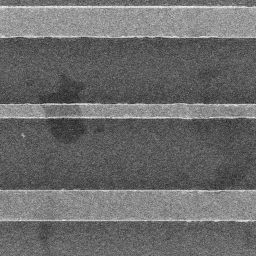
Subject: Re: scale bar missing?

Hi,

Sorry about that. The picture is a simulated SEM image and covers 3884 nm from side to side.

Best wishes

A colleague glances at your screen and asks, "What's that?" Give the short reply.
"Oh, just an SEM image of lines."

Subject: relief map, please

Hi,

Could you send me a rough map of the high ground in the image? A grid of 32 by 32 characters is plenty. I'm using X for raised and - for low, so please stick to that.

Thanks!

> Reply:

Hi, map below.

--------------------------------
XXXXXXXXXXXXXXXXXXXXXXXXXXXXXXXX
XXXXXXXXXXXXXXXXXXXXXXXXXXXXXXXX
XXXXXXXXXXXXXXXXXXXXXXXXXXXXXXXX
XXXXXXXXXXXXXXXXXXXXXXXXXXXXXXXX
--------------------------------
--------------------------------
--------------------------------
--------------------------------
--------------------------------
--------------------------------
--------------------------------
--------------------------------
XXXXXXXXXXXXXXXXXXXXXXXXXXXXXXXX
XXXXXXXXXXXXXXXXXXXXXXXXXXXXXXXX
--------------------------------
--------------------------------
--------------------------------
--------------------------------
--------------------------------
--------------------------------
--------------------------------
--------------------------------
--------------------------------
XXXXXXXXXXXXXXXXXXXXXXXXXXXXXXXX
XXXXXXXXXXXXXXXXXXXXXXXXXXXXXXXX
XXXXXXXXXXXXXXXXXXXXXXXXXXXXXXXX
XXXXXXXXXXXXXXXXXXXXXXXXXXXXXXXX
--------------------------------
--------------------------------
--------------------------------
--------------------------------